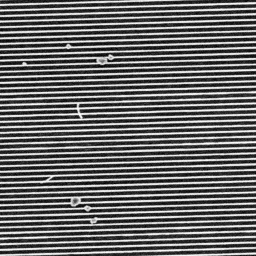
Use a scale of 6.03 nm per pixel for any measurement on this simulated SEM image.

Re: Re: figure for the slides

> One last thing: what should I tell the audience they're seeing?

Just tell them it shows parallel lines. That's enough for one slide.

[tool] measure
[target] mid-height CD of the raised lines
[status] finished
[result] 0.0068 um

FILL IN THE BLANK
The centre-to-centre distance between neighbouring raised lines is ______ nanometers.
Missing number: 33.5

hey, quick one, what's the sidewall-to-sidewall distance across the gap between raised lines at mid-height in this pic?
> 24.9 nm